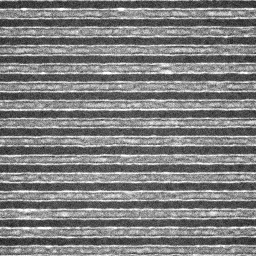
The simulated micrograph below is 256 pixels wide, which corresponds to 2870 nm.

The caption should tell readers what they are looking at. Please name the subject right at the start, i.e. parallel lines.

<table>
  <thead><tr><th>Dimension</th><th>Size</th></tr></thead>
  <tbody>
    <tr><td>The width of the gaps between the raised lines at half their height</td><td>0.0981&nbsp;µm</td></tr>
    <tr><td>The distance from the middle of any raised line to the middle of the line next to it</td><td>204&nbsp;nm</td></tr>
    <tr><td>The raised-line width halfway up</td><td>106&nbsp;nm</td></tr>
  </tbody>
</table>